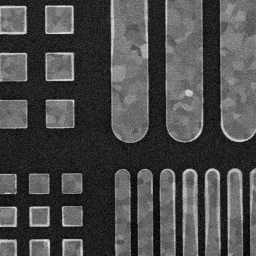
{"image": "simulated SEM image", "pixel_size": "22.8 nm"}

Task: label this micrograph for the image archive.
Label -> groups of lines, slits or small figures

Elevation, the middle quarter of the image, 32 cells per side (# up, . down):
##..........#########.....######
##..........#########.....######
##..........#########.....######
##..........#########.....######
............#########.....######
............#########.....######
............#########.....######
............#########.....######
............#########.....######
##..........#########.....######
##..........#########.....######
##..........#########.....######
##..........#########.....######
###.........#########.....######
###.........#########.....######
###.........#########.....######
............#########.....######
.............#######......######
..............#####........#####
................................
................................
................................
................................
................................
................................
................................
..............#.....#....##.....
####.........###...###..###...##
####.........###...###..####..##
####.........###...###..###...##
####.........###...###..###...##
####.........###...###..###...##